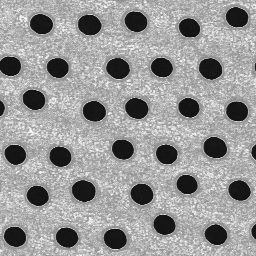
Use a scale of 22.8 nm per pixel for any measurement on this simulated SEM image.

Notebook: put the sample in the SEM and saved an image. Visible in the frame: a regular array of holes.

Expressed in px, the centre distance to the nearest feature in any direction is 43.9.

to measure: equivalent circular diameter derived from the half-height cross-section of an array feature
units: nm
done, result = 486